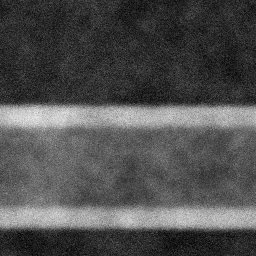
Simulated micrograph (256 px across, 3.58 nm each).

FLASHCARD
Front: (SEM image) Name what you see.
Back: one or a few lines or trenches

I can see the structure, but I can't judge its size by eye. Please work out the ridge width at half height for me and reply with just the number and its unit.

362 nm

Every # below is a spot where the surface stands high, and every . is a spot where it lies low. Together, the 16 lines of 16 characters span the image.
................
................
................
................
................
................
................
################
################
################
################
################
################
################
................
................